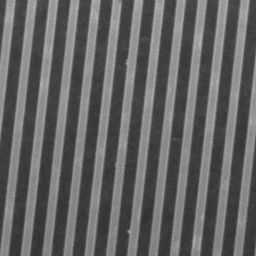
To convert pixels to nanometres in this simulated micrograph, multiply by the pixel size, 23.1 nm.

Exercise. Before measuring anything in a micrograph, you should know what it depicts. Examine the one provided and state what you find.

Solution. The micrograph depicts parallel lines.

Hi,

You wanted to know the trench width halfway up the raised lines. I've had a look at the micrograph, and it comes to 0.305 um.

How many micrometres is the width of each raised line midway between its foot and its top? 0.181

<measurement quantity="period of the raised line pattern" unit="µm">0.489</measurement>